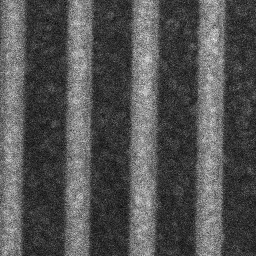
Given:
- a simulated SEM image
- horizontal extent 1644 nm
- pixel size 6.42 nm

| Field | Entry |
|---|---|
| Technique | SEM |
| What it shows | one or a few lines or trenches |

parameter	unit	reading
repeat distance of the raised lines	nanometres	424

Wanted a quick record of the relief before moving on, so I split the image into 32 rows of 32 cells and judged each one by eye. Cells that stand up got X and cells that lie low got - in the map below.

---XXXXXX--XXXXXX---XXXXX---XXXX
---XXXXXX--XXXXXX---XXXXX---XXXX
---XXXXXX--XXXXXX---XXXXX---XXXX
---XXXXXX--XXXXXX---XXXXX---XXXX
---XXXXXX--XXXXXX---XXXXX---XXXX
---XXXXXX--XXXXXX---XXXXX---XXXX
---XXXXXX--XXXXXX---XXXXX---XXXX
---XXXXXX--XXXXXX---XXXXX---XXXX
---XXXXXX--XXXXXX---XXXXX---XXXX
---XXXXXX--XXXXXX---XXXXX---XXXX
---XXXXXX--XXXXXX--XXXXXX---XXXX
---XXXXXX--XXXXXX--XXXXXX---XXXX
---XXXXXX--XXXXXX--XXXXXX---XXXX
---XXXXXX--XXXXXX--XXXXXX---XXXX
---XXXXXX--XXXXXX--XXXXXX---XXXX
---XXXXXX--XXXXXX--XXXXXX---XXXX
---XXXXX---XXXXXX--XXXXXX---XXXX
---XXXXX---XXXXXX--XXXXXX---XXXX
---XXXXX---XXXXXX--XXXXXX---XXXX
---XXXXX---XXXXXX--XXXXXX---XXXX
---XXXXX---XXXXXX--XXXXXX---XXXX
---XXXXXX--XXXXXX--XXXXXX---XXXX
---XXXXX---XXXXX---XXXXXX---XXXX
---XXXXX---XXXXX---XXXXXX---XXXX
---XXXXX---XXXXX---XXXXXX---XXXX
---XXXXX---XXXXX---XXXXXX---XXXX
---XXXXX---XXXXX---XXXXXX---XXXX
---XXXXX---XXXXX---XXXXXX--XXXXX
---XXXXX---XXXXX---XXXXXX--XXXXX
---XXXXX---XXXXX---XXXXXX---XXXX
--XXXXXX---XXXXX---XXXXXX--XXXXX
--XXXXXX---XXXXX---XXXXXX--XXXXX